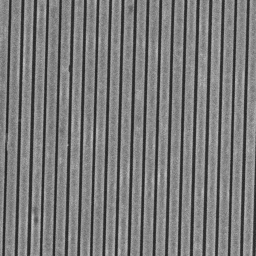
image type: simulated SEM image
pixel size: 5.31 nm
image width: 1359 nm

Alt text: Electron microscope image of parallel lines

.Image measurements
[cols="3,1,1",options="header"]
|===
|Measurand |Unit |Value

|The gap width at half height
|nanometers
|17.9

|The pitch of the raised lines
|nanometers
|66.5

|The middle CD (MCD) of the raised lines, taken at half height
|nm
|49.7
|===